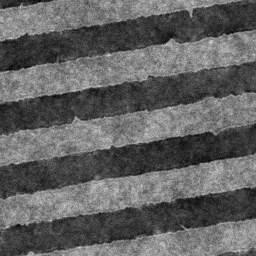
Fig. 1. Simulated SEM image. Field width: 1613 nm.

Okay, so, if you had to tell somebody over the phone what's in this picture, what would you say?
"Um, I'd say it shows one or a few lines or trenches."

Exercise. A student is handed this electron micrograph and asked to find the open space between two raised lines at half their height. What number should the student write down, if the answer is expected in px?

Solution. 31.7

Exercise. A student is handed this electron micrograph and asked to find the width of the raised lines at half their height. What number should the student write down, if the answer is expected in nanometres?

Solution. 189